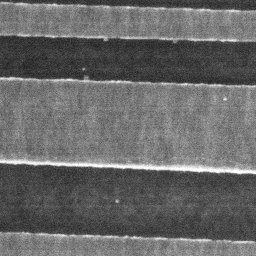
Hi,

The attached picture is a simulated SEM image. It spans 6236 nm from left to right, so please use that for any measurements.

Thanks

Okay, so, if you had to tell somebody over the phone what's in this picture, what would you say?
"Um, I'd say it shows lines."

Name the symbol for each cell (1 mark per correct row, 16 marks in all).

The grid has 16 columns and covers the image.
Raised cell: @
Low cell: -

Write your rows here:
@@@@@@@@@-------
@@@@@@@@@@@@@@@@
-------------@@@
----------------
----------------
@@@@@@@@@@@@@@@@
@@@@@@@@@@@@@@@@
@@@@@@@@@@@@@@@@
@@@@@@@@@@@@@@@@
@@@@@@@@@@@@@@@@
--------@@@@@@@@
----------------
----------------
----------------
----------------
@@@@@@@@@@@@@@@@